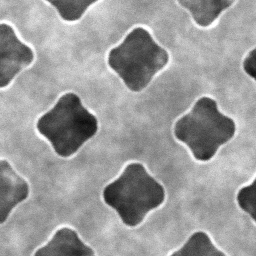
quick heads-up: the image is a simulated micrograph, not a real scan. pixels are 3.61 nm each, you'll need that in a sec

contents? holes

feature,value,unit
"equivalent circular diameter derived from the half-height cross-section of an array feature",206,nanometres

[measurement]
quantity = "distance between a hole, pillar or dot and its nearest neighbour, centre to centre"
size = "346 nm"